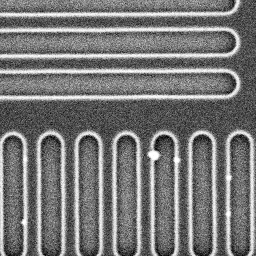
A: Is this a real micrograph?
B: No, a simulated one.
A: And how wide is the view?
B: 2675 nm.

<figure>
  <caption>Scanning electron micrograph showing groups of lines, slits or small figures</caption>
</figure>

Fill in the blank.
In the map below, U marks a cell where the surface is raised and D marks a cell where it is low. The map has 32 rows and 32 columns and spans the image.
DDDDDDDDDDDDDDDDDDDDDDDDDDDDDDUU
DDDDDDDDDDDDDDDDDDDDDDDDDDDDDUUU
UUUUUUUUUUUUUUUUUUUUUUUUUUUUUUUU
UUUUUUUUUUUUUUUUUUUUUUUUUUUUUUUU
DDDDDDDDDDDDDDDDDDDDDDDDDDDDDUUU
DDDDDDDDDDDDDDDDDDDDDDDDDDDDDDUU
DDDDDDDDDDDDDDDDDDDDDDDDDDDDDUUU
UUUUUUUUUUUUUUUUUUUUUUUUUUUUUUUU
UUUUUUUUUUUUUUUUUUUUUUUUUUUUUUUU
DDDDDDDDDDDDDDDDDDDDDDDDDDDDDUUU
DDDDDDDDDDDDDDDDDDDDDDDDDDDDDDUU
DDDDDDDDDDDDDDDDDDDDDDDDDDDDDUUU
UUUUUUUUUUUUUUUUUUUUUUUUUUUUUUUU
UUUUUUUUUUUUUUUUUUUUUUUUUUUUUUUU
UUUUUUUUUUUUUUUUUUUUUUUUUUUUUUUU
UUUUUUUUUUUUUUUUUUUUUUUUUUUUUUUU
UUUUUUUUUUUUUUUUUUUUUUUUUUUUUUUU
DDDUUDDDUUDDUUUDDUUDDDUUDDDUUDDU
DDDUUDDDUUDDDUDDDUUDDDUUDDDUUDDU
DDDUUDDDUUDDDUDDDUUUDDUUDDDUUDDU
DDDUUDDDUUDDDUDDDUUDDDUUDDDUUDDU
DDDUUDDDUUDDDUDDDUUDDDUUDDDUUDDU
DDDUUDDDUUDDDUDDDUUDDDUUDDDUUDDU
DDDUUDDDUUDDDUDDDUUDDDUUDDDUUDDU
DDDUUDDDUUDDDUDDDUUDDDUUDDDUUDDU
DDDUUDDDUUDDDUDDDUUDDDUUDDDUUDDU
DDDUUDDDUUDDDUDDDUUDDDUUDDDUUDDU
DDDUUDDDUUDDDUDDDUUDDDUUDDDUUDDU
DDDUUDDDUUDDDUDDDUUDDDUUDDDUUDDU
DDDUUDDDUUDDDUDDDUUDDDUUDDDUUDDU
DDDUUDDDUUDDDUDDDUUDDDUUDDDUUDDU
DDDUUDDDUUDDUUUDDUUDDDUUDDDUUDDU